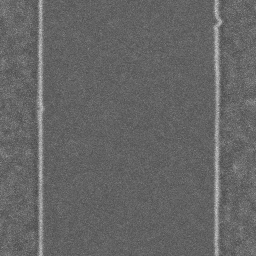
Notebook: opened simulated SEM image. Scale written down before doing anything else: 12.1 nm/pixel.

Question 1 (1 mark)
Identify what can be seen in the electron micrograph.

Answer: one or a few lines or trenches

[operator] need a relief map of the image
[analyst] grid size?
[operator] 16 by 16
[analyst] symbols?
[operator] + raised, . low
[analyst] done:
...++++++++++...
...+++++++++++..
...+++++++++++..
...+++++++++++..
...+++++++++++..
...+++++++++++..
...+++++++++++..
...+++++++++++..
...+++++++++++..
...+++++++++++..
...+++++++++++..
...+++++++++++..
...+++++++++++..
...++++++++++...
...++++++++++...
...++++++++++...